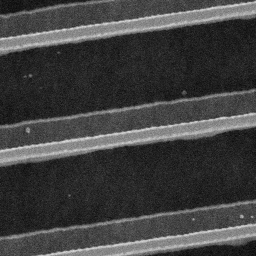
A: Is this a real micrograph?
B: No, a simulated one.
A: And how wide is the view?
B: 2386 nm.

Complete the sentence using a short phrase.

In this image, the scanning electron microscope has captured lines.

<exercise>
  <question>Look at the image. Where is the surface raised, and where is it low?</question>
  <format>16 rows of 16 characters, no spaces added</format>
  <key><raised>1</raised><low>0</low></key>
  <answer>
0001111111111111
1111111111110000
1111100000000000
0000000000000000
0000000000000000
0000000000000000
0000000000111111
0001111111111111
1111111111110000
1111100000000000
0000000000000000
0000000000000000
0000000000000000
0000000000111111
0001111111111111
1111111111100000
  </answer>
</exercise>